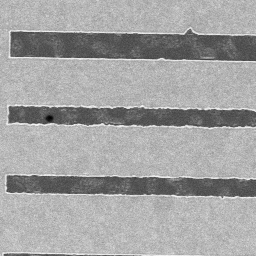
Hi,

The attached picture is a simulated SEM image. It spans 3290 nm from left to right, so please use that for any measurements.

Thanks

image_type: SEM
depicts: one or a few lines or trenches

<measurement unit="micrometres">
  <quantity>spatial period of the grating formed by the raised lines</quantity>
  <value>0.895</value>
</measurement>